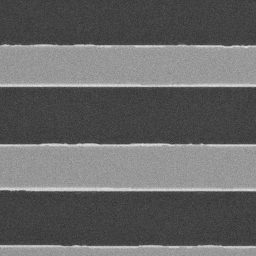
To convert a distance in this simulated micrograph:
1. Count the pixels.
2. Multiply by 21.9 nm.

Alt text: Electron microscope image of lines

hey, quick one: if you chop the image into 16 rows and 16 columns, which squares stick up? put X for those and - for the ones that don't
----------------
----------------
----------------
XXXXXXXXXXXXXXXX
XXXXXXXXXXXXXXXX
----------------
----------------
----------------
----------------
XXXXXXXXXXXXXXXX
XXXXXXXXXXXXXXXX
XXXXXXXXXXXXXXXX
----------------
----------------
----------------
XXXXXXXXXXXXXXXX